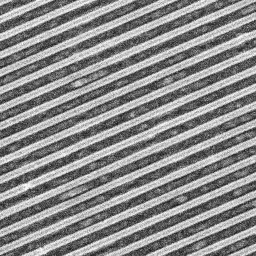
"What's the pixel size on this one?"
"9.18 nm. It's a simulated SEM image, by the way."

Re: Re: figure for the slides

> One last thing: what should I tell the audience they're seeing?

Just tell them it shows parallel lines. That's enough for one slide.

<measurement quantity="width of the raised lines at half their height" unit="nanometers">51.6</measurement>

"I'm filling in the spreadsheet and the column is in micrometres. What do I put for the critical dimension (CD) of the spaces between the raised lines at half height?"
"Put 0.0958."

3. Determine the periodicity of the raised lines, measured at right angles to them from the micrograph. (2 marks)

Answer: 150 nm